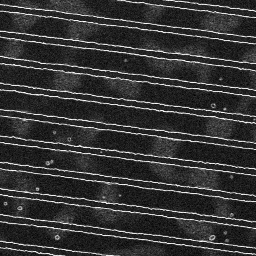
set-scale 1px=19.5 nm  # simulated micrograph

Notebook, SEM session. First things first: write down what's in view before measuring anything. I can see parallel lines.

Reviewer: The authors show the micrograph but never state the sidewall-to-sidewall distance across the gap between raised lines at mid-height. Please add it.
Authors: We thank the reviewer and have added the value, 116 nanometres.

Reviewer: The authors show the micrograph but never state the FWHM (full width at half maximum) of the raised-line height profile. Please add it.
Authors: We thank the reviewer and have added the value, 0.395 microns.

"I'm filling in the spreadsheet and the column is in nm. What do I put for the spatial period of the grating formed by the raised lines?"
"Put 510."